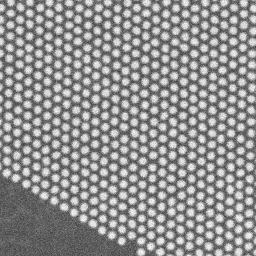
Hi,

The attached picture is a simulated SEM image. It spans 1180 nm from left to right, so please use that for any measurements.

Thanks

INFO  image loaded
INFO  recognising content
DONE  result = a regular array of raised bodies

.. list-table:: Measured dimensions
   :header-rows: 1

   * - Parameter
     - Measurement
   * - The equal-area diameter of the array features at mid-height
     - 34.1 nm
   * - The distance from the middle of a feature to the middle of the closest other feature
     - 0.0495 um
